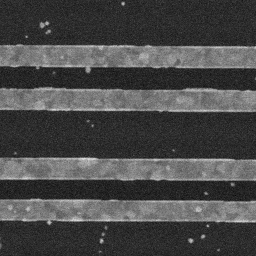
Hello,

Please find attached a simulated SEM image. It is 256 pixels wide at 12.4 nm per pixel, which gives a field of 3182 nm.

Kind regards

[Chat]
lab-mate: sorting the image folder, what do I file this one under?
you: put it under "lines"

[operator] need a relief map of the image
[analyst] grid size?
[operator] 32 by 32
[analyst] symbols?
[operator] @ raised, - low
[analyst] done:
--------------------------------
--------------------------------
--------------------------------
--------------------------------
--------------------------------
--------------------------------
@@@@@@@@@@@@@@@@@@@@@@@@@@@@@@@@
@@@@@@@@@@@@@@@@@@@@@@@@@@@@@@@@
--------------------------------
--------------------------------
--------------------------------
@@@@@@@@@@@@@@@@@@@@@@@@@@@@@@@@
@@@@@@@@@@@@@@@@@@@@@@@@@@@@@@@@
@@@@@@@@@@@@@@@@@@@@@@@@@@@@@@@@
--------------------------------
--------------------------------
--------------------------------
--------------------------------
--------------------------------
--------------------------------
@@@@@@@@@@@@@@@@@@@@@@@@@@@@@@@@
@@@@@@@@@@@@@@@@@@@@@@@@@@@@@@@@
--------------------------------
--------------------------------
--------------------------------
@@@@@@@@@@@@@@@@@@@@@@@@@@@@@@@@
@@@@@@@@@@@@@@@@@@@@@@@@@@@@@@@@
---@@--@@@@@@@@@@@@@@@@@@@@@@@@@
--------------------------------
--------------------------------
--------------------------------
--------------------------------